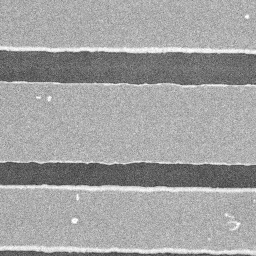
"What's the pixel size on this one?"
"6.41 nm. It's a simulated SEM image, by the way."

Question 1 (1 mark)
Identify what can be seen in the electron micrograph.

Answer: lines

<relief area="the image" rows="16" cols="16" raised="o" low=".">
oooooooooooooooo
oooooooooooooooo
oooooooooooooooo
................
................
oooooooooooooooo
oooooooooooooooo
oooooooooooooooo
oooooooooooooooo
oooooooooooooooo
................
................
oooooooooooooooo
oooooooooooooooo
oooooooooooooooo
oooooooooooooooo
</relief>